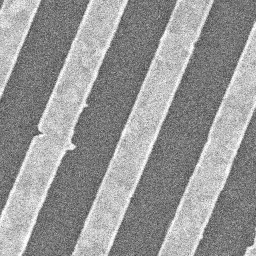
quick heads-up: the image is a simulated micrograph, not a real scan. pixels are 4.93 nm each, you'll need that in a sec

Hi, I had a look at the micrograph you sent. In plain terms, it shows one or a few lines or trenches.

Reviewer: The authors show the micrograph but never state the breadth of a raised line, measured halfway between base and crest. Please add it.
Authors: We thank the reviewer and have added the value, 153 nm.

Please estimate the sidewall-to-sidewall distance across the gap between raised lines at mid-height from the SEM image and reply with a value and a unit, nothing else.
238 nm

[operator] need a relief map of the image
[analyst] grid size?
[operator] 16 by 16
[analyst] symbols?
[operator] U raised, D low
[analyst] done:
UUDDDDUUDDDUUDDD
UUDDDUUDDDDUUDDD
UDDDDUUDDDUUDDDD
UDDDUUDDDDUUDDDU
UDDDUUDDDUUDDDDU
DDDUUUDDDUUDDDUU
DDDUUDDDUUUDDDUU
DDDUUDDDUUDDDUUU
DDUUDDDDUUDDDUUD
DDUUDDDUUDDDDUUD
DUUUDDDUUDDDUUDD
DUUDDDUUDDDDUUDD
DUUDDDUUDDDUUDDD
UUDDDDUUDDDUUDDD
UUDDDUUDDDDUUDDD
UDDDDUUDDDUUDDDD